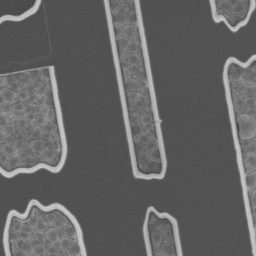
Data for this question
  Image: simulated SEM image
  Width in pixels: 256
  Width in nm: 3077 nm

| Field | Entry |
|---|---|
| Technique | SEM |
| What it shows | one or a few lines or trenches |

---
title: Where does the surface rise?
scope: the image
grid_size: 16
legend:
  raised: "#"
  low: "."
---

..#####..####...
#######..#####.#
#######..#######
#######..#######
#..####..#####..
...#####.#####..
....####..####..
....####..#####.
....####..#####.
....####..#####.
..######..#####.
###############.
###############.
#...#####.######
.....####..#####
.....####..#####